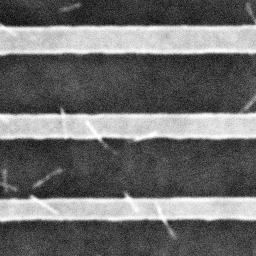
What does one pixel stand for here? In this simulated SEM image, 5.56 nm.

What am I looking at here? lines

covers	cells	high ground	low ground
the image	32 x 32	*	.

................................
................................
................................
********************************
********************************
********************************
********.***.***..********.....*
................................
................................
................................
................................
................................
................................
................................
********************************
********************************
********************************
................................
................................
................................
................................
................................
................................
................................
................................
********************************
********************************
*...............................
................................
................................
................................
................................